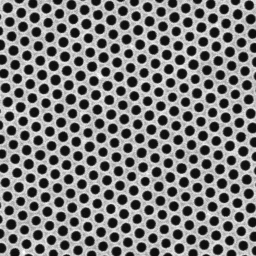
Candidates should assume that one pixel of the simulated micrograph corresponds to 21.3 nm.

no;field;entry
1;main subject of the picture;a regular array of holes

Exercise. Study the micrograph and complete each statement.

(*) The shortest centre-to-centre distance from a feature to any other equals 301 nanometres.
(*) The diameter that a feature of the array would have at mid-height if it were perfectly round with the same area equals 221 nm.